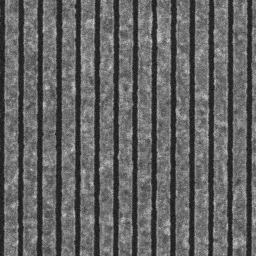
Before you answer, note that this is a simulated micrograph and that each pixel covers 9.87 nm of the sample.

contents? parallel lines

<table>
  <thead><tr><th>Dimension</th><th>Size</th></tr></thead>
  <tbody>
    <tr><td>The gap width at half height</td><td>59.2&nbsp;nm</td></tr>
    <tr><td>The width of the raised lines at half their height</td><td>127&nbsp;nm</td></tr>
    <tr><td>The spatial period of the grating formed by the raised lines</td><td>188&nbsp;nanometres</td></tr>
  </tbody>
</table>